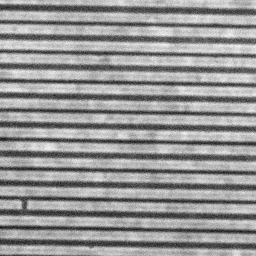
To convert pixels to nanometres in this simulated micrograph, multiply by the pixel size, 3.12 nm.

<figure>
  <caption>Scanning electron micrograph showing parallel lines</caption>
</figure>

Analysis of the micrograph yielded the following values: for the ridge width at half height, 23.8 nanometers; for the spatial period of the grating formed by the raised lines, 45.6 nm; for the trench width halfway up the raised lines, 0.0238 µm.